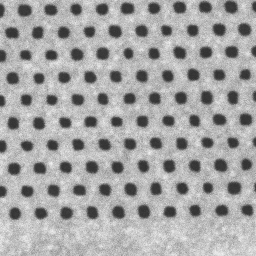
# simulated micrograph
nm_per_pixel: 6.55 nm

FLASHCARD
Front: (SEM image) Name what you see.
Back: a regular array of holes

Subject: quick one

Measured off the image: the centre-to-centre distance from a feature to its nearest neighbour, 168 nanometers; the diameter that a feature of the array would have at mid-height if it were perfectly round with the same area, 82.7 nanometers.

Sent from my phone